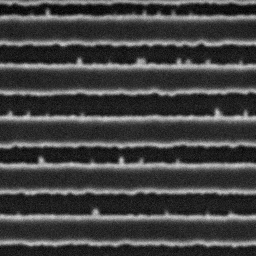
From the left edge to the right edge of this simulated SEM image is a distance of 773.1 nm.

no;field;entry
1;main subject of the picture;lines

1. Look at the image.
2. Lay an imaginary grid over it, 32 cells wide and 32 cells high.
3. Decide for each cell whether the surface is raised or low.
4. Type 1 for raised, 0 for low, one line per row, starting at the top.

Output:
00111000000000000000000000000000
00000000000000000000000000000000
11111111111111111111111111111111
11111111111111111111111111111111
11111111111111111111111111111111
11111111101101111110111111110111
00000000000000000000000000000000
00000000000000000000000000000000
11111111111111111111111111111111
11111111111111111111111111111111
11111111111111111111111111111111
11111111111111111111111111111010
00000000000000000000000000000000
00000000000000000000000000000000
00000000000000000000000000000000
11111111111111111111111111111111
11111111111111111111111111111111
11111111111111111111111111111111
00000000000000000000000000000000
00000000000000000000000000000000
00000001110000000001100000000011
11111111111111111111111111111111
11111111111111111111111111111111
11111111111111111111111111111111
00000000000000000000000000000000
00000000000000000000000000000000
00000000000000000000000000000000
11111111111111111111111111111111
11111111111111111111111111111111
11111111111111111111111111111111
00011111000111101111011101111111
00000000000000000000000000000000